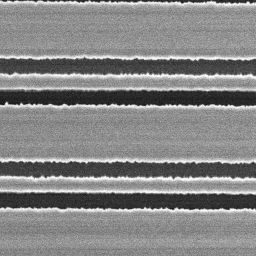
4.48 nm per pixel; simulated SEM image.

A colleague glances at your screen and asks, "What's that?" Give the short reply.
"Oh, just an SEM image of lines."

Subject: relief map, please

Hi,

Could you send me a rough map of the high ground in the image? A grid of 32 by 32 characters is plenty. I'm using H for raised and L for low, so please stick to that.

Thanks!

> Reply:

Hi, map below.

HHHHHHHHHHHHHHHHHHHHHHHHHHHHHHHH
HHHHHHHHHHHHHHHHHHHHHHHHHHHHHHHH
HHHHHHHHHHHHHHHHHHHHHHHHHHHHHHHH
HHHHHHHHHHHHHHHHHHHHHHHHHHHHHHHH
HHHHHHHHHHHHHHHHHHHHHHHHHHHHHHHH
HHHHHHHHHHHHHHHHHHHHHHHHHHHHHHHH
HHHHHHHHHHHHHHHHHHHHHHHHHHHHHHHH
LLLLLLLLLLLLLLLLLLLLLLLLLLLLLLLL
LLLLLLLLLLLLLLLLLLLLLLLLLLLLLLLL
HHHHHHHHHHHHHHHHHHHHHHHHHHHHHHHH
HHHHHHHHHHHHHHHHHHHHHHHHHHHHHHHH
LLLLLLLLLLLLLLLLLLLLLLLLLLLLLLLL
LLLLLLLLLLLLLLLLLLLLLLLLLLLLLLLL
HHHHHHHHHHHHHHHHHHHHHHHHHHHHHHHH
HHHHHHHHHHHHHHHHHHHHHHHHHHHHHHHH
HHHHHHHHHHHHHHHHHHHHHHHHHHHHHHHH
HHHHHHHHHHHHHHHHHHHHHHHHHHHHHHHH
HHHHHHHHHHHHHHHHHHHHHHHHHHHHHHHH
HHHHHHHHHHHHHHHHHHHHHHHHHHHHHHHH
HHHHHHHHHHHHHHHHHHHHHHHHHHHHHHHH
LLLLLLLLLLLLLLLLLLLLLLLLLLLLLLLL
LLLLLLLLLLLLLLLLLLLLLLLLLLLLLLLL
HHHHHHHHHHHHHHHHHHHHHHHHHHHHHHHH
HHHHHHHHHHHHHHHHHHHHHHHHHHHHHHHH
LLLLLLLLLLLLLLLLLLLLLLLLLLLLLLLL
LLLLLLLLLLLLLLLLLLLLLLLLLLLLLLLL
HHHHHHHHHHHHHHHHHHHHHHHHHHHHHHHH
HHHHHHHHHHHHHHHHHHHHHHHHHHHHHHHH
HHHHHHHHHHHHHHHHHHHHHHHHHHHHHHHH
HHHHHHHHHHHHHHHHHHHHHHHHHHHHHHHH
HHHHHHHHHHHHHHHHHHHHHHHHHHHHHHHH
HHHHHHHHHHHHHHHHHHHHHHHHHHHHHHHH